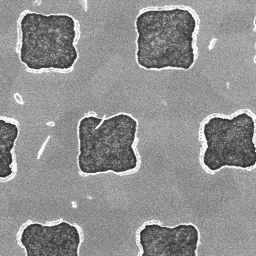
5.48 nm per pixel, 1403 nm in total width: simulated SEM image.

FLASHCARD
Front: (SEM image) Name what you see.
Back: holes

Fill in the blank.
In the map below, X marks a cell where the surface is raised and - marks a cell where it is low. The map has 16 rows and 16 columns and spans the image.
XXXXXXXXXXXXXXXX
X----XXXX---XXXX
X----XXXX---XXXX
X----XXXX---XXXX
XXXXXXXXXXXXXXXX
XXXXXXXXXXXXXXXX
XXXXXXXXXXXXXXXX
XXXXX---XXXXX---
-XXXX---XXXXX---
-XXXX---XXXXX---
-XXXX---XXXXX-XX
XXXXXXXXXXXXXXXX
XXXXXXXXXXXXXXXX
XXXXXXXXXXXXXXXX
X----XXXX---XXXX
XX---XXXX---XXXX